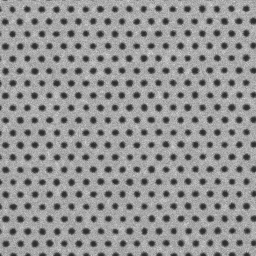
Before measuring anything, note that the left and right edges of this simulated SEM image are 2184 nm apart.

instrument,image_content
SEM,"a regular array of holes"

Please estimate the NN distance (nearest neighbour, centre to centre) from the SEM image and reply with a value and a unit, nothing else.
120 nanometres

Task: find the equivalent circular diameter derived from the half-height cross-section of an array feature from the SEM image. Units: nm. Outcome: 60.1